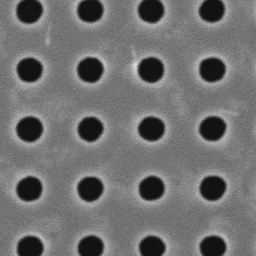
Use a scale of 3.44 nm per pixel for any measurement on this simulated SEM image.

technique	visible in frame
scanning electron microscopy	a regular array of holes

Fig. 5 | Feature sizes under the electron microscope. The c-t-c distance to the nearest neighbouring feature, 204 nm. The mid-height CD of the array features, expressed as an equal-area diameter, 89.9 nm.